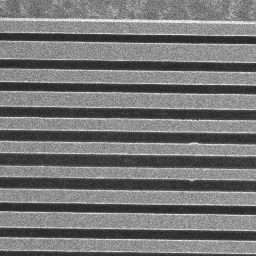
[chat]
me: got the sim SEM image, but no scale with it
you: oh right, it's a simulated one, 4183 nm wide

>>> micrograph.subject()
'parallel lines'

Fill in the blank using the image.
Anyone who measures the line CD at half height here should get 241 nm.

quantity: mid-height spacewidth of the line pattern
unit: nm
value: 141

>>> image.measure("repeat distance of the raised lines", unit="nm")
395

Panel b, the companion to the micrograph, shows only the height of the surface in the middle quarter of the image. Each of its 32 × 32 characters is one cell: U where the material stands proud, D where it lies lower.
DDDDDDDDDDDDDDDDDDDDDDDDDDDDDDDD
UUUUUUUUUUUUDDDDDDDDDDDDDDDDDDDD
UUUUUUUUUUUUUUUUUUUUUUUUUUUUUUUU
UUUUUUUUUUUUUUUUUUUUUUUUUUUUUUUU
UUUUUUUUUUUUUUUUUUUUUUUUUUUUUUUU
DDDDDDDDDDDDDDDDDDDDDDDDDDDDDDDD
DDDDDDDDDDDDDDDDDDDDDDDDDDDDDDDD
UUUUUUUUUUUUUUUUUUUUUUUUUUUUUUUU
UUUUUUUUUUUUUUUUUUUUUUUUUUUUUUUU
UUUUUUUUUUUUUUUUUUUUUUUUUUUUUUUU
UUUUUUUUUUUUUUUUUUUUUUUUUUUUUUUU
DDDDDDDDDDDDDDDDDDDDDDDDDDDDDDDD
DDDDDDDDDDDDDDDDDDDDDDDDDDDDDDDD
UUUUDDDDDDDDDDDDDDDDDDDDDDDDDDDD
UUUUUUUUUUUUUUUUUUUUUUUUUUUUUUUU
UUUUUUUUUUUUUUUUUUUUUUUUUUUUUUUU
UUUUUUUUUUUUUUUUUUUUUUUUUUUUUUUU
DDDDDDDDDDDDDDDDDDDDDDDDDDDDDDDD
DDDDDDDDDDDDDDDDDDDDDDDDDDDDDDDD
DDDDDDDDDDDDDDDDDDDDDDDDDDDDDDDD
UUUUUUUUUUUUUUUUUUUUUUUUUUUUUUUU
UUUUUUUUUUUUUUUUUUUUUUUUUUUUUUUU
UUUUUUUUUUUUUUUUUUUUUUUUUUUUUUUU
DDDDDDDDDDDDDDDDDDDDDDDDDDDDDDDD
DDDDDDDDDDDDDDDDDDDDDDDDDDDDDDDD
DDDDDDDDDDDDDDDDDDDDDDDDDDDDDDDD
UUUUUUUUUUUUUUUUUUUUUUUUUUUUUUUU
UUUUUUUUUUUUUUUUUUUUUUUUUUUUUUUU
UDUUUUUUUUUUUUUUUUUUUUUUUUUUUUUU
DDDDDDDDDDDDDDDDDDDDDDDDDDDDDDDD
DDDDDDDDDDDDDDDDDDDDDDDDDDDDDDDD
UUUUUUUUDDDDDDDDDDDDDDDDDDDDDDDD